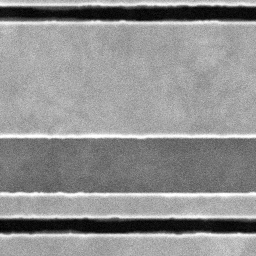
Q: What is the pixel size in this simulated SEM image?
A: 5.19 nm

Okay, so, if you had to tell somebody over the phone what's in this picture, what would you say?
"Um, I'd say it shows lines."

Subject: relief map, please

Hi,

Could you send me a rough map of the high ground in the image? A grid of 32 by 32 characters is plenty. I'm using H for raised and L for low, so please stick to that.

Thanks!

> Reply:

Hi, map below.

HHHHHHHHHHHHHHHHHHHHHHHHHHHHHHHH
LLLLLLLLLLLLLLLLLLLLLLLLLLLLLLLL
LLLLLLLLLLLLLLLLLLLLLLLLLLLLLLLL
HHHHHHHHHHHHHHHHHHHHHHHHHHHHHHHH
HHHHHHHHHHHHHHHHHHHHHHHHHHHHHHHH
HHHHHHHHHHHHHHHHHHHHHHHHHHHHHHHH
HHHHHHHHHHHHHHHHHHHHHHHHHHHHHHHH
HHHHHHHHHHHHHHHHHHHHHHHHHHHHHHHH
HHHHHHHHHHHHHHHHHHHHHHHHHHHHHHHH
HHHHHHHHHHHHHHHHHHHHHHHHHHHHHHHH
HHHHHHHHHHHHHHHHHHHHHHHHHHHHHHHH
HHHHHHHHHHHHHHHHHHHHHHHHHHHHHHHH
HHHHHHHHHHHHHHHHHHHHHHHHHHHHHHHH
HHHHHHHHHHHHHHHHHHHHHHHHHHHHHHHH
HHHHHHHHHHHHHHHHHHHHHHHHHHHHHHHH
HHHHHHHHHHHHHHHHHHHHHHHHHHHHHHHH
HHHHHHHHHHHHHHHHHHHHHHHHHHHHHHHH
LLLLLLLLLLLLLLLLLLLLLLLLLLLLLLLL
LLLLLLLLLLLLLLLLLLLLLLLLLLLLLLLL
LLLLLLLLLLLLLLLLLLLLLLLLLLLLLLLL
LLLLLLLLLLLLLLLLLLLLLLLLLLLLLLLL
LLLLLLLLLLLLLLLLLLLLLLLLLLLLLLLL
LLLLLLLLLLLLLLLLLLLLLLLLLLLLLLLL
LLLLLLLLLLLLLLLLLLLLLLLLLLLLLLLL
HHHHHHHHHHHHHHHHHHHHHHHHHHHHHHHH
HHHHHHHHHHHHHHHHHHHHHHHHHHHHHHHH
HHHHHHHHHHHHHHHHHHHHHHHHHHHHHHHH
LLLLLLLLLLLLLLLLLLLLLLLLLLLLLLLL
LLLLLLLLLLLLLLLLLLLLLLLLLLLLLLLL
HHHHHHHHHHHHHHHHHHHHHHHHHHHHHHHH
HHHHHHHHHHHHHHHHHHHHHHHHHHHHHHHH
HHHHHHHHHHHHHHHHHHHHHHHHHHHHHHHH